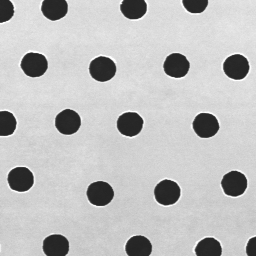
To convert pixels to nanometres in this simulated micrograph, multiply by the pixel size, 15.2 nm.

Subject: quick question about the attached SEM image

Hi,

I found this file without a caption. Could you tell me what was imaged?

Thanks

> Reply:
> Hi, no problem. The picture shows a regular array of holes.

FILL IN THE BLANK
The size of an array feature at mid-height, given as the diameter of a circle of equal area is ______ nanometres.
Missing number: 394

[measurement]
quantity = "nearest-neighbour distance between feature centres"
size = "988 nanometers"